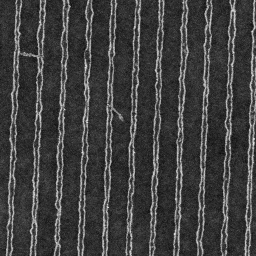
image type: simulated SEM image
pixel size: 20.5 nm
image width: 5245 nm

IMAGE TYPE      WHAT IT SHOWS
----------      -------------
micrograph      parallel lines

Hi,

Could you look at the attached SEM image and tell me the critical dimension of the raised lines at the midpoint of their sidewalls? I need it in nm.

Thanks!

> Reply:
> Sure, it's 94.7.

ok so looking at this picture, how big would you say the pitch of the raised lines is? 23.8 pixels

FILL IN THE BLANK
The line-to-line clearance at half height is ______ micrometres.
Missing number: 0.397